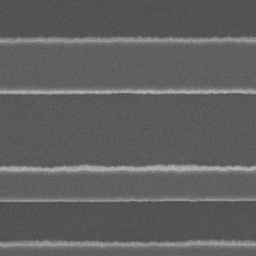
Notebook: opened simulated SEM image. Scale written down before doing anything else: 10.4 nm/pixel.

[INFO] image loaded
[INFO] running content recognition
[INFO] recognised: lines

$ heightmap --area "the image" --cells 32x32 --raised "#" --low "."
................................
................................
................................
................................
................................
################################
################################
################################
################################
################################
################################
..#.###...#.....................
................................
................................
................................
................................
................................
................................
................................
................................
................................
################################
################################
################################
################################
................................
................................
................................
................................
................................
.......................#####.#..
################################